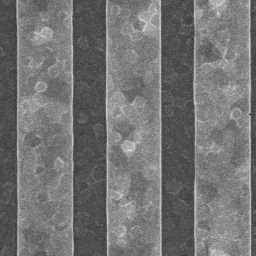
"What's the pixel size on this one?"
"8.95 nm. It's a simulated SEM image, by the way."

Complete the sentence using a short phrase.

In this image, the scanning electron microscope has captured one or a few lines or trenches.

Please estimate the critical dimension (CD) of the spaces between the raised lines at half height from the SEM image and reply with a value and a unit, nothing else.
303 nanometres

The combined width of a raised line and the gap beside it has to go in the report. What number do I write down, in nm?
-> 794